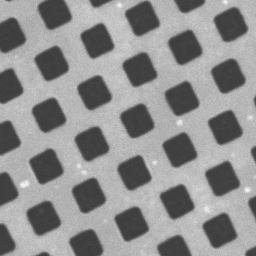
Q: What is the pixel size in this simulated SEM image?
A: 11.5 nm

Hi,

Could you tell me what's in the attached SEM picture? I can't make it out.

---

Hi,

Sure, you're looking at a regular array of holes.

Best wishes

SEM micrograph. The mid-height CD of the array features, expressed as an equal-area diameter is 376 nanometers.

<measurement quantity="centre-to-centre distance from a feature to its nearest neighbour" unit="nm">582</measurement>